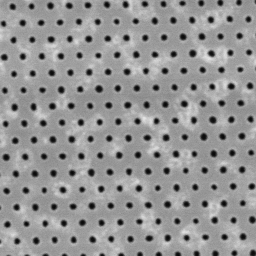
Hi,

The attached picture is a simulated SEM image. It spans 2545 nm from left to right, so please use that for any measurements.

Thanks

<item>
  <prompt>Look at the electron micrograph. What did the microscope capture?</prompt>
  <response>a regular array of holes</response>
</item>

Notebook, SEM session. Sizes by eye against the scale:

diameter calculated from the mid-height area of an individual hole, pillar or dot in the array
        0.0682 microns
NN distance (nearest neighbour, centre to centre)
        184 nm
